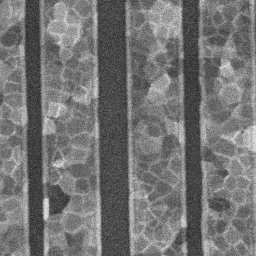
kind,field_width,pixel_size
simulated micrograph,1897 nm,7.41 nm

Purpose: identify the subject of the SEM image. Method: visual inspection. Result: one or a few lines or trenches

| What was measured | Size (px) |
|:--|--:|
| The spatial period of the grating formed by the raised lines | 81.7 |